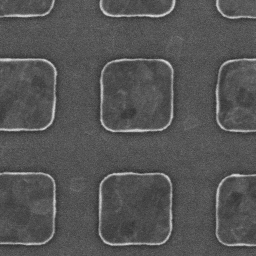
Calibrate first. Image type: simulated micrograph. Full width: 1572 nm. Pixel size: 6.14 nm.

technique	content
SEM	raised bodies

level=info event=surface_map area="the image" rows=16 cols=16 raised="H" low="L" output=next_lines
HHHLLLHHHHHLLLHH
LLLLLLLLLLLLLLLL
LLLLLLLLLLLLLLLL
LLLLLLLLLLLLLLLL
HHHLLLHHHHHLLLHH
HHHLLLHHHHHLLLHH
HHHLLLHHHHHLLLHH
HHHLLLHHHHHLLLHH
LLLLLLLLLLLLLLLL
LLLLLLLLLLLLLLLL
LLLLLLLLLLLLLLLL
HHHLLLHHHHHLLLHH
HHHLLLHHHHHLLLHH
HHHLLLHHHHHLLLHH
HHHLLLHHHHHLLLHH
LLLLLLLLLLLLLLLL